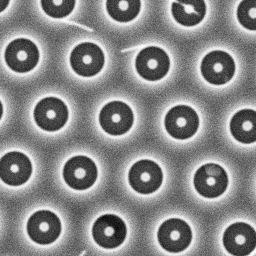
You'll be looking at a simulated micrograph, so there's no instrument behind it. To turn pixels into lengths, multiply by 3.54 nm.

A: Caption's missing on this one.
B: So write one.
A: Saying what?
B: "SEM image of an array of small figures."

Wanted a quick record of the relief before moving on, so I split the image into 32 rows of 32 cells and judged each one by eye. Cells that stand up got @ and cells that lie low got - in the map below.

-@@@@----@@@@-----@@@-----@@@@--
@@@@@----@@@@-----@@@-----@@@---
@@@@@@@@@@@@@@---@@@@@---@@@@@--
@@@@@@@@@@@@@@@@@@@@@@@@@@@@@@--
@@@@@@@@@@@@@@@@@@@@@@@@@@@@@@@@
@---@@@@@@--@@@@@@@@@@@@@@@@@@@@
@----@@@@----@@@@----@@@@@--@@@@
-----@@@@----@@@@----@@@@----@@@
@---@@@@@----@@@@----@@@@-----@@
@@@@@@@@@@--@@@@@----@@@@----@@@
@@@@@@@@@@@@@@@@@@@@@@@@@@--@@@@
@@@@@@@@@@@@@@@@@@@@@@@@@@@@@@@@
@@@@@---@@@@@@@@@@@@@@@@@@@@@@@@
@@@@-----@@@@---@@@@@---@@@@@@@@
@@@@-----@@@-----@@@@----@@@@---
@@@@----@@@@-----@@@-----@@@@---
@@@@@@@@@@@@@---@@@@@----@@@@---
@@@@@@@@@@@@@@@@@@@@@@-@@@@@@---
@@@@@@@@@@@@@@@@@@@@@@@@@@@@@@@@
---@@@@@@--@@@@@@@@@@@@@@@@@@@@@
----@@@@----@@@@@---@@@@@--@@@@@
----@@@@----@@@@----@@@@----@@@@
----@@@@----@@@@----@@@@-----@@@
@@@@@@@@@--@@@@@----@@@@----@@@@
@@@@@@@@@@@@@@@@@@@@@@@@@---@@@@
@@@@@@@@@@@@@@@@@@@@@@@@@@@@@@@@
@@@@---@@@@@@@@@@@@@@@@@@@@@@@@@
@@@-----@@@@---@@@@@@--@@@@@@@@@
@@@-----@@@-----@@@@----@@@@----
@@@@----@@@-----@@@@----@@@@----
@@@@@-@@@@@@---@@@@@----@@@@----
@@@@@@@@@@@@@@@@@@@@@--@@@@@----